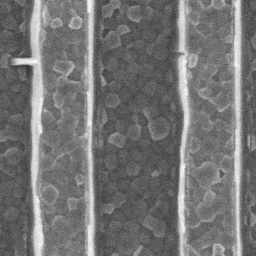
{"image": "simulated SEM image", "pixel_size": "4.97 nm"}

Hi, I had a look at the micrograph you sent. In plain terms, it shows one or a few lines or trenches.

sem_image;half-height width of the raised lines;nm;287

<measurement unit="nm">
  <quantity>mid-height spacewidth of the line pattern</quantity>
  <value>445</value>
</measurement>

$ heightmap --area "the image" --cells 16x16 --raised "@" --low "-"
--@@@@-----@@@@-
--@@@@-----@@@@-
--@@@@-----@@@@-
--@@@@-----@@@@-
--@@@@-----@@@@-
--@@@@-----@@@@-
--@@@@------@@@-
--@@@@------@@@-
--@@@@-----@@@@-
--@@@@-----@@@@-
--@@@@-----@@@@-
--@@@@-----@@@@-
--@@@@-----@@@@-
--@@@@-----@@@@-
--@@@@-----@@@@-
--@@@@-----@@@@-